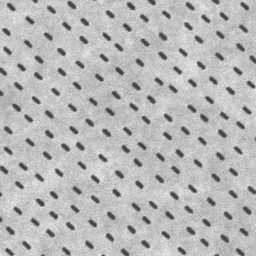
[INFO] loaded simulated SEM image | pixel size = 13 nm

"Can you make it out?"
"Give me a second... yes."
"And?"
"a regular array of holes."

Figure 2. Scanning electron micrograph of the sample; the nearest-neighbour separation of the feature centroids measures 0.246 um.